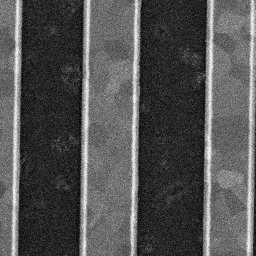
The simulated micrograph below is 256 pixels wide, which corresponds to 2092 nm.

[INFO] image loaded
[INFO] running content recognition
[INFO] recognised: one or a few lines or trenches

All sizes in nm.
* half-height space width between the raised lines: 600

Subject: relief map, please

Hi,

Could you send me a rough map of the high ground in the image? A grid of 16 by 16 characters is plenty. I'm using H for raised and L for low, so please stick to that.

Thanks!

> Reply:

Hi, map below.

HLLLLLHHLLLLLHHH
HLLLLLHHLLLLLHHH
HLLLLLHHLLLLLHHH
HLLLLHHHLLLLLHHH
HLLLLHHHLLLLLHHH
HLLLLHHHLLLLLHHH
HLLLLHHHLLLLLHHH
HLLLLHHHLLLLLHHH
HLLLLHHHLLLLLHHH
HLLLLHHHLLLLLHHH
HLLLLHHHLLLLLHHH
HLLLLHHHLLLLLHHH
HLLLLHHHLLLLLHHH
HLLLLHHHLLLLLHHH
HLLLLHHHLLLLLHHH
HLLLLHHHLLLLLHHH